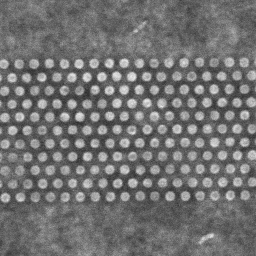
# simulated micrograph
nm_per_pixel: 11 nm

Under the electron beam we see a regular array of raised bodies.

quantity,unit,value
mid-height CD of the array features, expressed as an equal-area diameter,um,0.095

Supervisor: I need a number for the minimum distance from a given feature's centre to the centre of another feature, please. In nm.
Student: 161